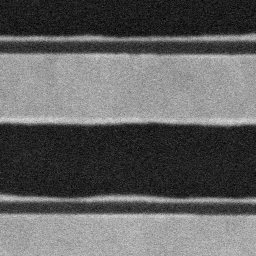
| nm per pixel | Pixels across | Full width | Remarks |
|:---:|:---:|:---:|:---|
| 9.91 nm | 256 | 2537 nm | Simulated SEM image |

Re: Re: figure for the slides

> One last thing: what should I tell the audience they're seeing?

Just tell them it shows lines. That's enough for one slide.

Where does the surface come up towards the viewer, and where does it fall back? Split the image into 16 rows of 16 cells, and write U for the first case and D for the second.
DDDDDDDDDDDDDDDD
DDDDDDDDDDDDDDDD
DDDDDDDDDDDDDDDD
UUUUUUUUUUUUUUUU
UUUUUUUUUUUUUUUU
UUUUUUUUUUUUUUUU
UUUUUUUUUUUUUUUU
DDDDDDDDDDUUUUUU
DDDDDDDDDDDDDDDD
DDDDDDDDDDDDDDDD
DDDDDDDDDDDDDDDD
DDDDDDDDDDDDDDDD
DDDDDDDDDDDDDDDD
UUUUUUUUUUUUUDDD
UUUUUUUUUUUUUUUU
UUUUUUUUUUUUUUUU